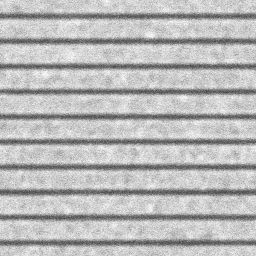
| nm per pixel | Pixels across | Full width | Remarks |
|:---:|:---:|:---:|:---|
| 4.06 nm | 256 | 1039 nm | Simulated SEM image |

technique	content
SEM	parallel lines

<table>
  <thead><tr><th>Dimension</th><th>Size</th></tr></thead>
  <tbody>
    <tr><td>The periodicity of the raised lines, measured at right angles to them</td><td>102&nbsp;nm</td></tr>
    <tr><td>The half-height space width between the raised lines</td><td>31.5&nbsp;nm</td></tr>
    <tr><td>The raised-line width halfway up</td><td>0.0706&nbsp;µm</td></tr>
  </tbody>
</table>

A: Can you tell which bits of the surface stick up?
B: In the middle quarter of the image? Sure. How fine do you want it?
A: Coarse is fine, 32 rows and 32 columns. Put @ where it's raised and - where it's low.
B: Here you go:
--------------------------------
--------------------------------
@@@@@@@@@@@@@@@@@@@@@@@@@@@@@@@@
@@@@@@@@@@@@@@@@@@@@@@@@@@@@@@@@
@@@@@@@@@@@@@@@@@@@@@@@@@@@@@@@@
@@@@@@@@@@@@@@@@@@@@@@@@@@@@@@@@
--------------------------------
--------------------------------
@@@@@@@@@@@@@@@@@@@@@@@@@@@@@@@@
@@@@@@@@@@@@@@@@@@@@@@@@@@@@@@@@
@@@@@@@@@@@@@@@@@@@@@@@@@@@@@@@@
@@@@@@@@@@@@@@@@@@@@@@@@@@@@@@@@
--------------------------------
--------------------------------
@@@@@@@@@@@@@@@@@@@@@@@@@@@@@@@@
@@@@@@@@@@@@@@@@@@@@@@@@@@@@@@@@
@@@@@@@@@@@@@@@@@@@@@@@@@@@@@@@@
@@@@@@@@@@@@@@@@@@@@@@@@@@@@@@@@
--------------------------------
--------------------------------
-----------@---@@---------------
@@@@@@@@@@@@@@@@@@@@@@@@@@@@@@@@
@@@@@@@@@@@@@@@@@@@@@@@@@@@@@@@@
@@@@@@@@@@@@@@@@@@@@@@@@@@@@@@@@
@@@@@@@@@@@@@@@@@@@@@@@@@@@@@@@@
--------------------------------
--------------------------------
@@@@@@@@@@@@@@@@@@@@@@@@@@@@@@@@
@@@@@@@@@@@@@@@@@@@@@@@@@@@@@@@@
@@@@@@@@@@@@@@@@@@@@@@@@@@@@@@@@
@@@@@@@@@@@@@@@@@@@@@@@@@@@@@@@@
--------------------------------